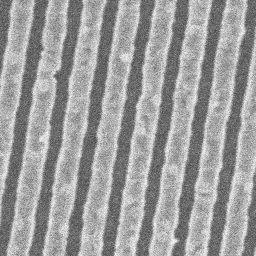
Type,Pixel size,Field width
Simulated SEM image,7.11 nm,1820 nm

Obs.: parallel lines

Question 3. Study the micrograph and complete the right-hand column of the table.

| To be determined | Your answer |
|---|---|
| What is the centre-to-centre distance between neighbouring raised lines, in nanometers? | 249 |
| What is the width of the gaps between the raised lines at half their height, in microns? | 0.109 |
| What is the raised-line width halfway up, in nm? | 143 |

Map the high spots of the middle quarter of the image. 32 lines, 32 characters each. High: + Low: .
...+++++...+++++....+++++....+++
..+++++....+++++....+++++....+++
..+++++....+++++....+++++....+++
..+++++....+++++....+++++....+++
..+++++....++++.....++++....++++
..+++++....++++.....++++....++++
..+++++...+++++.....++++....++++
..++++....+++++.....++++....++++
.+++++....+++++....+++++....++++
.+++++....+++++....+++++....++++
.+++++....+++++....+++++....++++
.+++++....+++++...++++++....++++
.+++++....++++....+++++....+++++
.+++++....++++....+++++....+++++
++++++...+++++....+++++....+++++
+++++....+++++....+++++....+++++
+++++....+++++....+++++....+++++
+++++....++++....+++++.....+++++
+++++....++++....+++++....+++++.
+++++....++++....+++++....+++++.
++++....+++++....+++++....+++++.
++++....+++++....+++++...++++++.
++++....+++++....+++++...++++++.
++++....+++++....+++++....+++++.
++++....++++.....++++....+++++..
++++...+++++....+++++....+++++..
+++....+++++....+++++....+++++..
+++....+++++....+++++....+++++..
+++....+++++....+++++...++++++..
+++....+++++....+++++...+++++...
+++....+++++....++++....+++++...
+++...++++++...+++++....+++++...